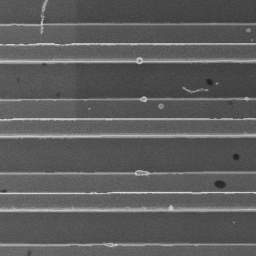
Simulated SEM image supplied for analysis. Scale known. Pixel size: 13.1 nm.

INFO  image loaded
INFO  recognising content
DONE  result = lines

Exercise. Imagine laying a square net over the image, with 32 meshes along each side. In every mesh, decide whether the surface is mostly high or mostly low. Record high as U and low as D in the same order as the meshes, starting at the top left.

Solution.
DDDDDDDDDDDDDDDDDDDDDDDDDDDDDDDD
DDDDDDDDDDDDDDDDDDDDDDDDDDDDDDDD
DDDDDDDDDDDDDDDDDDDDDDDDDDDDDDDD
UUUUUUUUUUUUUUUUUUUUUUUUUUUUUUUU
UUUUUUUUUUUUUUUUUUUUUUUUUUUUUUUU
UUUUUUUUUUUUUUUUUUUUUUUUUUUUUUUU
UUUUUUUUUUUUUUUUUUUUUUUUUUUUUUUU
UUUUUUUUUUUUUUUUUUUUUUUUUUUUUUUU
DDDDDDDDDDDDDDDDDDDDDDDDDDDDDDDD
DDDDDDDDDDDDDDDDDDDDDDDDDDDDDDDD
DDDDDDDDDDDDDDDDDDDDDDDDDDDDDDDD
DDDDDDDDDDDDDDDDDDDDDDDDDDDDDDDD
DDUUUUUUUUUUUUUUUUUUUUUUUUUUUUUU
UUUUUUUUUUUUUUUUUUUUUUUUUUUUUUUU
UUUUUUUUUUUUUUUUUUUUUUUUUUUUUUUU
UUUUUUUUUUUUUUUUUUUUUUUUUUUUUUUU
UUUUUUUUUUUUUUUUUUUUUUUUUUUUUUUU
DDDDDDDDDDDDDDDDDDDDDDDDDDDDDDDD
DDDDDDDDDDDDDDDDDDDDDDDDDDDDDDDD
DDDDDDDDDDDDDDDDDDDDDDDDDDDDDDDD
DDDDDDDDDDDDDDDDDDDDDDDDDDDDDDDD
DDDDDDDDDDDDDDDDDUDDDDDDDDDDDDDD
UUUUUUUUUUUUUUUUUUUUUUUUUUUUUUUU
UUUUUUUUUUUUUUUUUUUUUUUUUUUUUUUU
UUUUUUUUUUUUUUUUUUUUUUUUUUUUUUUU
UUUUUUUUUUUUUUUUUUUUUUUUUUUUUUUU
DDDDDDDDDDDDDDDDDDDDDDDDDDDDDDDD
DDDDDDDDDDDDDDDDDDDDDDDDDDDDDDDD
DDDDDDDDDDDDDDDDDDDDDDDDDDDDDDDD
DDDDDDDDDDDDDDDDDDDDDDDDDDDDDDDD
DDDDDDDDDDDDDUDDDDDDDDDDDDDDDDDD
UUUUUUUUUUUUUUUUUUUUUUUUUUUUUUUU